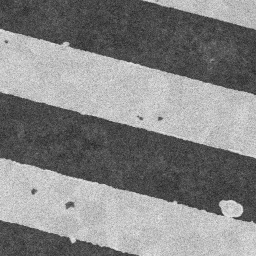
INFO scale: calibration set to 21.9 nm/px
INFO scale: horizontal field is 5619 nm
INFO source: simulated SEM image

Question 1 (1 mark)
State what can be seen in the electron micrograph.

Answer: one or a few lines or trenches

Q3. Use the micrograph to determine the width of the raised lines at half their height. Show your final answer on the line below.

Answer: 1220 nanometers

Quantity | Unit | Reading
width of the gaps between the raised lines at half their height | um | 1.41